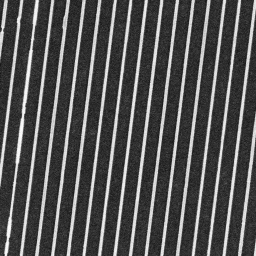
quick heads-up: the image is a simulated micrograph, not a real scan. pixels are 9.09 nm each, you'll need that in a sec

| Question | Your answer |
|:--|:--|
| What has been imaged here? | parallel lines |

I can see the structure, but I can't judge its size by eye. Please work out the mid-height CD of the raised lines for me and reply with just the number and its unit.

25.9 nm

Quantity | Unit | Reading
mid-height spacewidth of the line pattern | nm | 115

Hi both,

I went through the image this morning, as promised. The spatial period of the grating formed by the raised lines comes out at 0.141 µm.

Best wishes